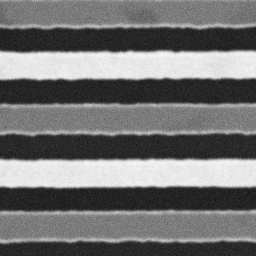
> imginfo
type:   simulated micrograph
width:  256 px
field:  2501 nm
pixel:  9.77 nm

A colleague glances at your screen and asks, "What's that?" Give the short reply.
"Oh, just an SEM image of lines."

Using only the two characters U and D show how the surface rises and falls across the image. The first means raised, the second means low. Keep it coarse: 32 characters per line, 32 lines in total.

UUUUUUUUUUUUUUUUUUUUUUUUUUUUUUUU
UUUUUUUUUUUUUUUUUUUUUUUUUUUUUUUU
UUUUUUUUUUUUUUUUUUUUUUUUUUUUUUUU
DUUUDUUDDUDDUDDDDDDDDDDDUUDDDUDD
DDDDDDDDDDDDDDDDDDDDDDDDDDDDDDDD
DDDDDDDDDDDDDDDDDDDDDDDDDDDDDDDD
DDDDDDDDDDDDDDDDDDDUUDDDDDDDDUUU
UUUUUUUUUUUUUUUUUUUUUUUUUUUUUUUU
UUUUUUUUUUUUUUUUUUUUUUUUUUUUUUUU
UUUUUUUUUUUUUUUUUUUUUUUUUUUUUUUU
DDDDDDDDDDDDDDDDDDDDDDDDDDDDDDDD
DDDDDDDDDDDDDDDDDDDDDDDDDDDDDDDD
DDDDDDDDDDDDDDDDDDDDDDDDDDDDDDDD
UUUUUUUUUUUUUUUUUUUUUUUUUUUUUUUU
UUUUUUUUUUUUUUUUUUUUUUUUUUUUUUUU
UUUUUUUUUUUUUUUUUUUUUUUUUUUUUUUU
UUUUUUUUUUUUUUUUUUUUUUUUUUUUUUUU
DDDDDDDDDDDDDDDDDDDDDDDDDDDDDDDD
DDDDDDDDDDDDDDDDDDDDDDDDDDDDDDDD
DDDDDDDDDDDDDDDDDDDDDDDDDDDDDDDD
UUUUUUUUUUUUUUUUUUUUUUUUUUUUUUUU
UUUUUUUUUUUUUUUUUUUUUUUUUUUUUUUU
UUUUUUUUUUUUUUUUUUUUUUUUUUUUUUUU
DDDDDDDDDDDDDDDDDDDDDDDDDDDDDDDD
DDDDDDDDDDDDDDDDDDDDDDDDDDDDDDDD
DDDDDDDDDDDDDDDDDDDDDDDDDDDDDDDD
UUUDDUDUUUUUUUUUUUUUUUUUUUUUUUUU
UUUUUUUUUUUUUUUUUUUUUUUUUUUUUUUU
UUUUUUUUUUUUUUUUUUUUUUUUUUUUUUUU
UUUUUUUUUUUUUUUUUUUUUUUUUUUUUUUU
DDDDDDDDDDDDDDDDDDDDDDDDDDDDDDDD
DDDDDDDDDDDDDDDDDDDDDDDDDDDDDDDD